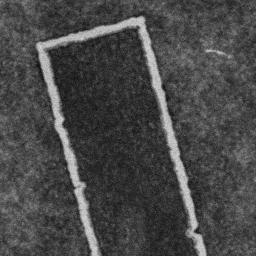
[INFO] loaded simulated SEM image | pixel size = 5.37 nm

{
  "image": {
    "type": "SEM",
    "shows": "one or a few lines or trenches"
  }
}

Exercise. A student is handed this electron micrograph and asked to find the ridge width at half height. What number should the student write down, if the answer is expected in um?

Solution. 0.559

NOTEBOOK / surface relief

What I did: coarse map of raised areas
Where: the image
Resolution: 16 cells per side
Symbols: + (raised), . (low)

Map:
................
........+.......
....+++++.......
...++++++.......
...+++++++......
...+++++++......
...+++++++......
....++++++......
....+++++++.....
....+++++++.....
.....++++++.....
.....+++++++....
.....+++++++....
.....+++++++....
......++++++....
......+++++++...